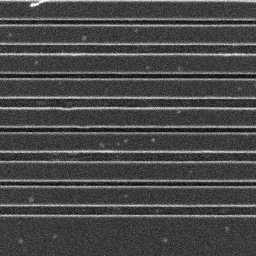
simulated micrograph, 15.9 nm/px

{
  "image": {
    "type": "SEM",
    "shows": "parallel lines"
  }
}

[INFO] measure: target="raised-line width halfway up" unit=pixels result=20.2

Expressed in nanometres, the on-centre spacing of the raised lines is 426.